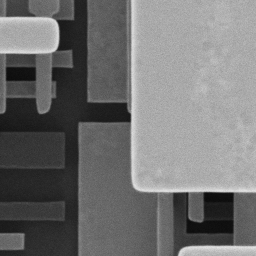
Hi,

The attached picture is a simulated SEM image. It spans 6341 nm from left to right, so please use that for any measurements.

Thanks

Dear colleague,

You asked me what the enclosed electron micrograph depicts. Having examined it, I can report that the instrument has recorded wiring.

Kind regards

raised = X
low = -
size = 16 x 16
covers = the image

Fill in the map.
--------XXXXXXXX
XXXX----XXXXXXXX
XXXX----XXXXXXXX
--------XXXXXXXX
--------XXXXXXXX
--------XXXXXXXX
--------XXXXXXXX
--------XXXXXXXX
--------XXXXXXXX
--------XXXXXXXX
--------XXXXXXXX
--------XXXXXXXX
----------------
----------------
----------------
------------XXXX